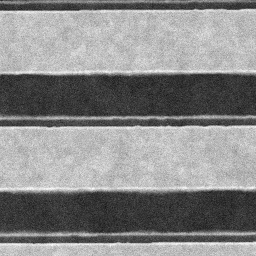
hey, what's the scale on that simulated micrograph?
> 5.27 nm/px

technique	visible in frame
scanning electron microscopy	lines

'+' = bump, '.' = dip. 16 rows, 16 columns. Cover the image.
................
++++++++++++++++
++++++++++++++++
++++++++++++++++
+++++++++.......
................
................
................
++++++++++++++++
++++++++++++++++
++++++++++++++++
++++++++++++++++
................
................
................
++++++++++++++++